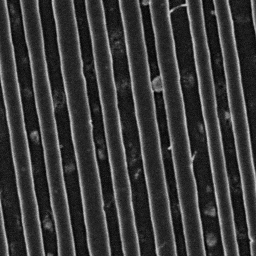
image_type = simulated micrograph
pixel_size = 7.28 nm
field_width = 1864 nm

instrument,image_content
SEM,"parallel lines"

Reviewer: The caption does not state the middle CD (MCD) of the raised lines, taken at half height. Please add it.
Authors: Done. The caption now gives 0.119 um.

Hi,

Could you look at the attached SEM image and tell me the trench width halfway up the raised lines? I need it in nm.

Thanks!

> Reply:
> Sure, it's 104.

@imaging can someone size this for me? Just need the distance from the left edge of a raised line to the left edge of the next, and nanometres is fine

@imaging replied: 232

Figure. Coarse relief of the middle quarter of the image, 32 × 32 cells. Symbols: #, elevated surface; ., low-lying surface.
#####...####....#####...####....
#####...####.....####...#####...
#####...####.....####...#####...
#####...####.....####...#####...
#####...####.....#####.######...
#####....####....############...
#####....####....#####...####...
.#####...####....#####...####...
.#####...####....#####...#####..
.#####...####.....####...#####..
.#####...####.....#####..#####..
.#####....####....#####...####..
.######...####....#####...####..
..#####...####....#####...####..
..#####...####....#####...####..
..#####...####.....####...#####.
..#####...####.....####...#####.
..#####...####.....#####..#####.
..#####....####....#####...####.
..#####....####....#####...####.
...#####...####....#####...####.
...#####...####....#####...#####
...#####...####....#####...#####
...#####...####.....####...#####
...#####...####.....#####..#####
...#####....####....#####...####
....####....####....#####...####
....#####...####....#####...####
....#####...####.....####...####
....#####...####.....####...####
....#####...#####....#####..####
....#####....####....#####...###